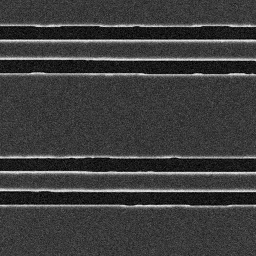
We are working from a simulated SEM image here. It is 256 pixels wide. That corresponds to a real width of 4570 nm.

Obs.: lines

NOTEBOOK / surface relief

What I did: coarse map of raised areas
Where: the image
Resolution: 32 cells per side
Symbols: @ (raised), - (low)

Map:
@@@@@@@@@@@@@@@@@@@@@@@@@@@@@@@@
@@@@@@@@@@@@@@@@@@@@@@@@@@@@@@@@
@@@@@@@@@@@@@@@@@@@@@@@@@@@@@@@@
--------------------------------
--------------------------------
@@@@@@@@@@@@@@@@@@@@@@@@@@@@@@@@
@@@@@@@@@@@@@@@@@@@@@@@@@@@@@@@@
--------------------------------
--------------------------------
@@@@@@@@@@@@@@@@@@@@@@@@@@@@@@@@
@@@@@@@@@@@@@@@@@@@@@@@@@@@@@@@@
@@@@@@@@@@@@@@@@@@@@@@@@@@@@@@@@
@@@@@@@@@@@@@@@@@@@@@@@@@@@@@@@@
@@@@@@@@@@@@@@@@@@@@@@@@@@@@@@@@
@@@@@@@@@@@@@@@@@@@@@@@@@@@@@@@@
@@@@@@@@@@@@@@@@@@@@@@@@@@@@@@@@
@@@@@@@@@@@@@@@@@@@@@@@@@@@@@@@@
@@@@@@@@@@@@@@@@@@@@@@@@@@@@@@@@
@@@@@@@@@@@@@@@@@@@@@@@@@@@@@@@@
@@@@@@@@@@@@@@@@@@@@@@@@@@@@@@@@
--------------------------------
@--@----------------------------
@@@@@@@@@@@@@@@@@@@@@@@@@@@@@@@@
@@@@@@@@@@@@@@@@@@@@@@@@@@@@@@@@
--------------------------------
--------------------------------
@@@@@@@@@@@@@@@@@@@@@@@@@@@@@@@@
@@@@@@@@@@@@@@@@@@@@@@@@@@@@@@@@
@@@@@@@@@@@@@@@@@@@@@@@@@@@@@@@@
@@@@@@@@@@@@@@@@@@@@@@@@@@@@@@@@
@@@@@@@@@@@@@@@@@@@@@@@@@@@@@@@@
@@@@@@@@@@@@@@@@@@@@@@@@@@@@@@@@